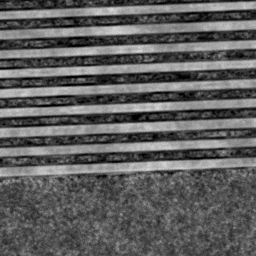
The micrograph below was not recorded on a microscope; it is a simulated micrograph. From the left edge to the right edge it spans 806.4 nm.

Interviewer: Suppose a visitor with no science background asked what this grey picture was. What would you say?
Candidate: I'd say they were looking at parallel lines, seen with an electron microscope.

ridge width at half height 27.1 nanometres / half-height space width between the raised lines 35.4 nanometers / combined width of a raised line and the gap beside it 61.5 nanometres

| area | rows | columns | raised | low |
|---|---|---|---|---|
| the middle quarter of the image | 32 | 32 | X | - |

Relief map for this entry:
---------XXXXXXXXXXXXXXXXXXXXXXX
XXXXXXXXXXXXXXXXXXXXXXXXXXXXXXXX
XXXXXXXX------------------------
--------------------------------
----X---------------------------
--------XXXXXXXXXXXXXXXXXXXXXXXX
XXXXXXXXXXXXXXXXXXXXXXXXXXXXXXXX
XXXXXXX-------------------------
--------------------------------
---------------------------XXXXX
--XXXXXXXXXXXXXXXXXXXXXXXXXXXXXX
XXXXXXXXXXXXXXXXXXXXXXXXXX------
X-------------------------------
--------------------------------
---------------------------XXXXX
--XXXXXXXXXXXXXXXXXXXXXXXXXXXXXX
XXXXXXXXXXXXXXXXXXXXXXXXXXXXXXX-
XXXXXX--------------------------
--------------------------------
--------------------------XXXXXX
-XXXXXXXXXXXXXXXXXXXXXXXXXXXXXXX
XXXXXXXXXXXXXXXXXXXXXXXXX-------
--------------------------------
--------------------------------
--------------------XXXXXXXXXXXX
XXXXXXXXXXXXXXXXXXXXXXXXXXXXXXXX
XXXXXXXXXXXXXXXXXXXXXXXX--------
--------------------------------
--------------------------------
--------------------------------
--------------------------------
--------------------------------